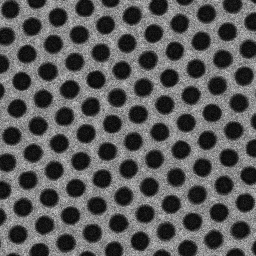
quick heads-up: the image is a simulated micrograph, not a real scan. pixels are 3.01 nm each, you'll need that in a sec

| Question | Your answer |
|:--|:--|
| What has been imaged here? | a regular array of holes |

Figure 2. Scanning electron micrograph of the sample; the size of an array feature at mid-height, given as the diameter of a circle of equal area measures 55 nm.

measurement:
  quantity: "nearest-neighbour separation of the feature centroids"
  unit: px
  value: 27.3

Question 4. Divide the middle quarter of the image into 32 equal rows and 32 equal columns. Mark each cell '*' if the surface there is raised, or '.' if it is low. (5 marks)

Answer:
.....********...***....********.
*...********.....********..****.
******....**....********....***.
******....***...********.....***
...***....********....**....****
....**....********....***..*****
....********...***....********..
...********....***...*********..
..*****.***.....********...***..
*****....**....********....***..
****.....***..****..***....*****
..***....********....**....*****
..***...********.....****.******
..********....**.....********...
..********....***...********....
****...***....********....**....
***.....**....********....***...
***.....********...***....******
.**.....*******....***....******
.***...********.....********..**
.********....**....********....*
*********....***..*********.....
***...***....********...***....*
**....***...********.....***..**
**....*********...***....*******
**....********....***...********
***..****.****....*********..***
********...***....********....**
*******.....***..****.****....**
*....**.....********...***....**
*....***...********.....***..***
*....*********...**.....*******.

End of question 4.